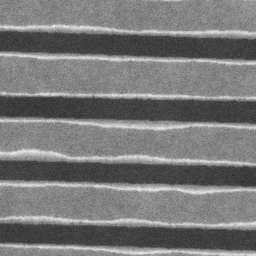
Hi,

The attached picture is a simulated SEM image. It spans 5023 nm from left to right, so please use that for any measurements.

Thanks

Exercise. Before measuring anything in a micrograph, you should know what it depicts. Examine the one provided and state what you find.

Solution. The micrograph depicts lines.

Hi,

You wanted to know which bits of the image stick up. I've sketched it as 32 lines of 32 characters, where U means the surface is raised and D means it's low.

UUUUUUUUUUUUUUUUUUUUUUUUUUUUUUUU
UUUUUUUUUUUUUUUUUUUUUUUUUUUUUUUU
UUUUUUUUUUUUUUUUUUUUUUUUUUUUUUUU
UUUUUUUUUUUUUUUUUUUUUUUUUUUUUUUU
DDDDDDDDDDDDDDDDDDDDDDDDDDDDDDDU
DDDDDDDDDDDDDDDDDDDDDDDDDDDDDDDD
DDDDDDDDDDDDDDDDDDDDDDDDDDDDDDDD
UUUUUUUUUUUUUUUUUUUUUUUUUUDDDDDD
UUUUUUUUUUUUUUUUUUUUUUUUUUUUUUUU
UUUUUUUUUUUUUUUUUUUUUUUUUUUUUUUU
UUUUUUUUUUUUUUUUUUUUUUUUUUUUUUUU
UUUUUUUUUUUUUUUUUUUUUUUUUUUUUUUU
DDDDDDDDDDDDDDDDDDDDDDDDDDDDDDDD
DDDDDDDDDDDDDDDDDDDDDDDDDDDDDDDD
DDDDDDDDDDDDDDDDDDDDDDDDDDDDDDDD
UUUUUUUUUUUUUUUUDDDDDDDDUDDDDDDD
UUUUUUUUUUUUUUUUUUUUUUUUUUUUUUUU
UUUUUUUUUUUUUUUUUUUUUUUUUUUUUUUU
UUUUUUUUUUUUUUUUUUUUUUUUUUUUUUUU
UUUDUUUUUUUUUUUUUUUUUUUUUUUUUUUU
DDDDDDDDDDDDDDDDDDDDDDDDDDDDDUUU
DDDDDDDDDDDDDDDDDDDDDDDDDDDDDDDD
DDDDDDDDDDDDDDDDDDDDDDDDDDDDDDDD
UUUUUUUUUUUUUUUUUUUUUUUDDDDDDDDD
UUUUUUUUUUUUUUUUUUUUUUUUUUUUUUUU
UUUUUUUUUUUUUUUUUUUUUUUUUUUUUUUU
UUUUUUUUUUUUUUUUUUUUUUUUUUUUUUUU
UDDDUUUUUUUUUUUUUUUUUUUUUUUUUUUU
DDDDDDDDDDDDDDDDDDDDDDDDDDDDDDDD
DDDDDDDDDDDDDDDDDDDDDDDDDDDDDDDD
DDDDDDDDDDDDDDDDDDDDDDDDDDDDDDDD
UUUUUUUUUUUUUUUUUUUUUUUUUUUDDDDD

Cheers